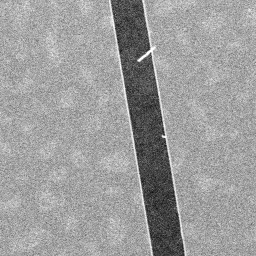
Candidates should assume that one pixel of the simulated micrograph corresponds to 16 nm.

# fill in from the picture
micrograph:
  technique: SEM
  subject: one or a few lines or trenches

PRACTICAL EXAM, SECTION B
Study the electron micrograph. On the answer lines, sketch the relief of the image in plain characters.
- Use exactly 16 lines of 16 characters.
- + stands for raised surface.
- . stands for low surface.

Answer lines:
+++++++..+++++++
+++++++..+++++++
+++++++..+++++++
+++++++...++++++
++++++++..++++++
++++++++..++++++
++++++++..++++++
++++++++..++++++
++++++++..++++++
++++++++...+++++
+++++++++..+++++
+++++++++..+++++
+++++++++..+++++
+++++++++..+++++
+++++++++..+++++
+++++++++...++++